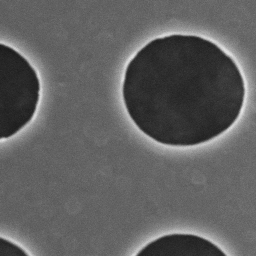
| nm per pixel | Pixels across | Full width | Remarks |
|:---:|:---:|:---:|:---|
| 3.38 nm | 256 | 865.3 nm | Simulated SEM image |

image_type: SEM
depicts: holes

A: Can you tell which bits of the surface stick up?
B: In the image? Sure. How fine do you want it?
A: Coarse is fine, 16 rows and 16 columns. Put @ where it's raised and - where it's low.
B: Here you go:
@@@@@@@@@@@@@@@@
@@@@@@@@@@@@@@@@
@@@@@@@@@@---@@@
-@@@@@@@------@@
--@@@@@@-------@
--@@@@@@-------@
--@@@@@@-------@
--@@@@@@-------@
-@@@@@@@@----@@@
@@@@@@@@@@@@@@@@
@@@@@@@@@@@@@@@@
@@@@@@@@@@@@@@@@
@@@@@@@@@@@@@@@@
@@@@@@@@@@@@@@@@
@@@@@@@@@@@@@@@@
-@@@@@@@@-----@@